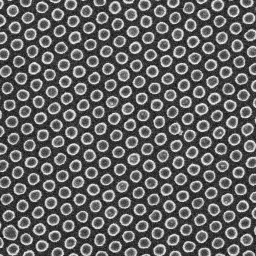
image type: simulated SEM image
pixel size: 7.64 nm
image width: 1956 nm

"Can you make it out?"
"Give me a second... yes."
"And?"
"a regular array of raised bodies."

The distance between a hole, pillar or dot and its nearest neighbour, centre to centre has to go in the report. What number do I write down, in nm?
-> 126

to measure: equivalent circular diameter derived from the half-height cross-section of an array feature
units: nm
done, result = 85.7